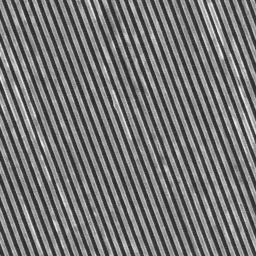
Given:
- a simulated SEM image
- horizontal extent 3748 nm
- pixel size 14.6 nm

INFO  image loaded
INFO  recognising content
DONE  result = parallel lines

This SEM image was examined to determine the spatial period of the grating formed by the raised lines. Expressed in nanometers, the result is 120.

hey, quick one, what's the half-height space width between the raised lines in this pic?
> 63.5 nm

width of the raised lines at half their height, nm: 56.6